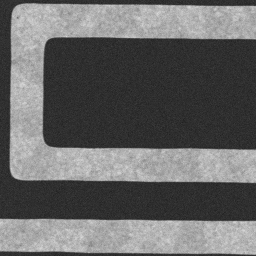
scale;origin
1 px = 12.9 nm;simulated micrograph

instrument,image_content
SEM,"groups of lines, slits or small figures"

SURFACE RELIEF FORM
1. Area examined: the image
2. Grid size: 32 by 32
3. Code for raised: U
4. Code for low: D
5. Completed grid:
DDDDDDDDDDDDDDDDDDDDDDDDDDDDDDDD
DDUUUUUUUUUUUUUUUUUUUUUUUUUUUUUU
DUUUUUUUUUUUUUUUUUUUUUUUUUUUUUUU
DUUUUUUUUUUUUUUUUUUUUUUUUUUUUUUU
DUUUUUUUUUUUUUUUUUUUUUUUUUUUUUUU
DUUUUUDDDDDDDDDDDDDDDDDDDDDDDDDD
DUUUUDDDDDDDDDDDDDDDDDDDDDDDDDDD
DUUUUDDDDDDDDDDDDDDDDDDDDDDDDDDD
DUUUUDDDDDDDDDDDDDDDDDDDDDDDDDDD
DUUUUDDDDDDDDDDDDDDDDDDDDDDDDDDD
DUUUUDDDDDDDDDDDDDDDDDDDDDDDDDDD
DUUUUDDDDDDDDDDDDDDDDDDDDDDDDDDD
DUUUUDDDDDDDDDDDDDDDDDDDDDDDDDDD
DUUUUDDDDDDDDDDDDDDDDDDDDDDDDDDD
DUUUUDDDDDDDDDDDDDDDDDDDDDDDDDDD
DUUUUDDDDDDDDDDDDDDDDDDDDDDDDDDD
DUUUUDDDDDDDDDDDDDDDDDDDDDDDDDDD
DUUUUDDDDDDDDDDDDDDDDDDDDDDDDDDD
DUUUUUUDDDDDDDDDDDDDDDDDDDDDDDDD
DUUUUUUUUUUUUUUUUUUUUUUUUUUUUUUU
DUUUUUUUUUUUUUUUUUUUUUUUUUUUUUUU
DUUUUUUUUUUUUUUUUUUUUUUUUUUUUUUU
DDDDDDDDDDDUUUUUUUUUUUUUUUUUUUUU
DDDDDDDDDDDDDDDDDDDDDDDDDDDDDDDD
DDDDDDDDDDDDDDDDDDDDDDDDDDDDDDDD
DDDDDDDDDDDDDDDDDDDDDDDDDDDDDDDD
DDDDDDDDDDDDDDDDDDDDDDDDDDDDDDDD
UUDDUUUDDDDDDDDDDDDDDDDDDDDDDDDD
UUUUUUUUUUUUUUUUUUUUUUUUUUUUUUUU
UUUUUUUUUUUUUUUUUUUUUUUUUUUUUUUU
UUUUUUUUUUUUUUUUUUUUUUUUUUUUUUUU
DDDDDDDDDUUUUUUUUUUUUUUUUUUUUUUU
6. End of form